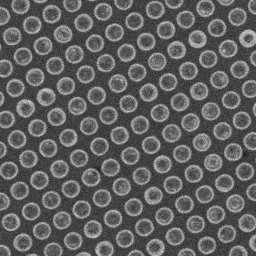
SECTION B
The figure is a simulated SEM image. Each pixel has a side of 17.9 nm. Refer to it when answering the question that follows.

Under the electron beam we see a regular array of raised bodies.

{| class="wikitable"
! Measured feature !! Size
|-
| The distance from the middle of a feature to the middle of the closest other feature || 403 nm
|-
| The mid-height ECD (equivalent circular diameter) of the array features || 304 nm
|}